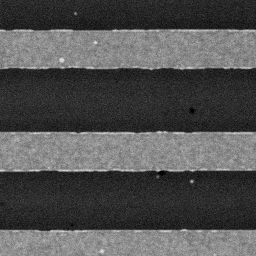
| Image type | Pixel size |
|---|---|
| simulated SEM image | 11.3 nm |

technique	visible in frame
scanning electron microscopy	lines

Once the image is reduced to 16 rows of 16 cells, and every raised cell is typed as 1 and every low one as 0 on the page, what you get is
0000000000000000
0000000000000000
1111111111111111
1111111111111111
0000000000000000
0000000000000000
0000000000000000
0000000000000000
1111111111111111
1111111111111111
1111111111111111
0000000000000000
0000000000000000
0000000000000000
1111111111111111
1111111111111111